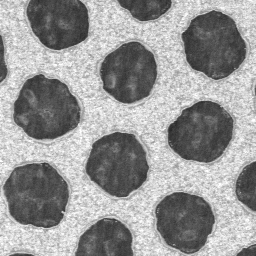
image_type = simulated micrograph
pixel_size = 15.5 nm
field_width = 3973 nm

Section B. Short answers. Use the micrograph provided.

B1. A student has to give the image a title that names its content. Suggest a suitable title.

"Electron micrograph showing holes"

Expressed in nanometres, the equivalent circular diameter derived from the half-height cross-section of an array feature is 982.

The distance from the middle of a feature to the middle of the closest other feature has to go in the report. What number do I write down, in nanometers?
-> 1370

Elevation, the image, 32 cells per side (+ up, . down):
++++......+++++......+++++++++++
+++........+++++.....+++++..++++
++++.......++++++..+++++.....+++
++++.......++++++++++++.......++
++++.......++++++++++++.......++
+++++.....++++++..+++++........+
.+++++++++++++.....++++........+
.++++++++++++......++++.......++
.+++++++++++........++++......++
.+++..++++++........++++++..++++
+++.....+++++......+++++++++++++
++.......++++......+++++++++++++
++........+++++...++++++++++++++
++........+++++++++++++.....++++
++........++++++++++++.......+++
++........+++++++++++........+++
+++......+++++.++++++........+++
+++++.++++++.....++++........+++
+++++++++++.......+++.......++++
+++++++++++.......++++......++++
++++..+++++........++++++++++++.
+......++++.......++++++++++++..
+.......+++.......++++++++++++..
.........+++.....++++++++++++...
+........+++++..+++++....+++++..
+.......++++++++++++......++++..
+.......+++++++++++........+++++
++......++++...+++++.......+++++
+++++++++++.....++++.......+++++
++++++++++.......+++......++++++
++++++++++.......++++.....++++++
+++++++++........++++++..+++++..